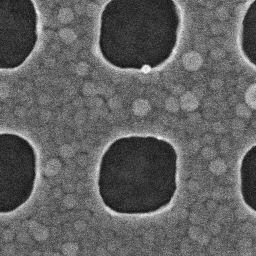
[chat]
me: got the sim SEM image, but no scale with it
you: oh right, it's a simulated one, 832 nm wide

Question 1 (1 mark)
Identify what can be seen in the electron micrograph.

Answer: holes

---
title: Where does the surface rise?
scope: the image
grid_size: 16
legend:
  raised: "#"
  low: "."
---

..#####....#####
..####.....####.
..####.....####.
..####.....####.
################
################
################
################
.#######.#######
..#####....#####
..####.....####.
..####.....####.
..####.....####.
################
################
################